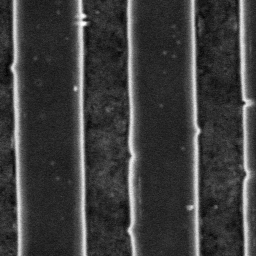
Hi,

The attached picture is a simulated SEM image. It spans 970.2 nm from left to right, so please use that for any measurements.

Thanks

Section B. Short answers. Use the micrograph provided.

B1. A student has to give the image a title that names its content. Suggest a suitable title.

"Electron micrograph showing one or a few lines or trenches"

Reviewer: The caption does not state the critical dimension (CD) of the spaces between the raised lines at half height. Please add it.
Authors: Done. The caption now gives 182 nm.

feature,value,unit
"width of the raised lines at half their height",247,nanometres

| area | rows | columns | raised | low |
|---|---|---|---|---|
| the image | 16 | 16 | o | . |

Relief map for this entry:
.oooo...oooo...o
.oooo...oooo...o
.oooo...oooo...o
.oooo...oooo...o
.oooo...oooo...o
.oooo...oooo...o
.oooo...oooo...o
.oooo...oooo...o
.oooo...oooo...o
.oooo...oooo...o
.oooo...oooo...o
.oooo...oooo...o
.oooo...oooo...o
.oooo...oooo...o
.oooo...oooo...o
.oooo...oooo...o